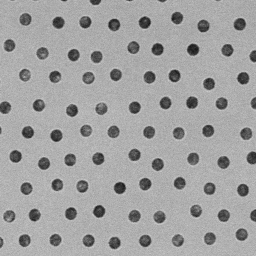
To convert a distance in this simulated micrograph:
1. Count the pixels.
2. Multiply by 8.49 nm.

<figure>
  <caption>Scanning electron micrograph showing a regular array of holes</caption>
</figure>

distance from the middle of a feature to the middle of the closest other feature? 226 nm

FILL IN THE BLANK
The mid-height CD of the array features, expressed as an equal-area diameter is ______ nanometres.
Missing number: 108